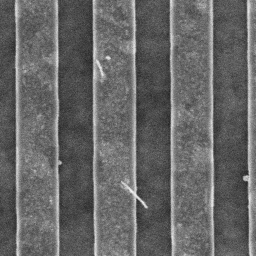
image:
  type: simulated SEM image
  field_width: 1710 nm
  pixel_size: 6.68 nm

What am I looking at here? wiring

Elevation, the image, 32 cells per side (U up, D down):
DDUUUUUDDDDDUUUUUDDDDUUUUUUDDDDU
DDUUUUUDDDDDUUUUUDDDDUUUUUUDDDDU
DDUUUUUDDDDDUUUUUDDDDUUUUUUDDDDU
DDUUUUUDDDDDUUUUUDDDDUUUUUUDDDDU
DDUUUUUDDDDDUUUUUDDDDUUUUUUDDDDU
DDUUUUUDDDDDUUUUUDDDDUUUUUUDDDDU
DDUUUUUDDDDDUUUUUDDDDUUUUUUDDDDU
DDUUUUUDDDDDUUUUUDDDDUUUUUUDDDDU
DDUUUUUDDDDDUUUUUDDDDUUUUUUDDDDU
DDUUUUUDDDDDUUUUUDDDDUUUUUUDDDDU
DDUUUUUDDDDDUUUUUDDDDUUUUUUDDDDU
DDUUUUUDDDDDUUUUUDDDDUUUUUUDDDDU
DDUUUUUDDDDDUUUUUDDDDUUUUUUDDDDU
DDUUUUUDDDDDUUUUUDDDDUUUUUUDDDDU
DDUUUUUDDDDDUUUUUDDDDUUUUUUDDDDU
DDUUUUUDDDDDUUUUUDDDDUUUUUUDDDDU
DDUUUUUDDDDDUUUUUDDDDUUUUUUDDDDU
DDUUUUUDDDDDUUUUUDDDDUUUUUUDDDDU
DDUUUUUDDDDDUUUUUDDDDUUUUUUDDDDU
DDUUUUUDDDDDUUUUUDDDDUUUUUUDDDDU
DDUUUUUDDDDDUUUUUDDDDUUUUUUDDDDU
DDUUUUUDDDDDUUUUUDDDDUUUUUUDDDDU
DDUUUUUDDDDDUUUUUDDDDUUUUUUDDDDU
DDUUUUUDDDDDUUUUUDDDDUUUUUUDDDDU
DDUUUUUDDDDDUUUUUDDDDUUUUUUDDDDU
DDUUUUUDDDDDUUUUUDDDDUUUUUUDDDDU
DDUUUUUDDDDDUUUUUDDDDUUUUUUDDDDU
DDUUUUUDDDDDUUUUUDDDDUUUUUUDDDDU
DDUUUUUDDDDDUUUUUDDDDUUUUUUDDDDU
DDUUUUUDDDDDUUUUUDDDDUUUUUUDDDDU
DDUUUUUDDDDDUUUUUDDDDDUUUUUDDDDU
DDUUUUUDDDDDUUUUUDDDDDUUUUUDDDDU